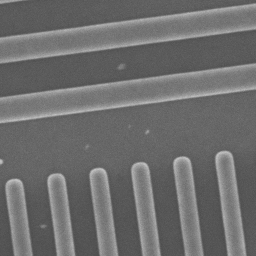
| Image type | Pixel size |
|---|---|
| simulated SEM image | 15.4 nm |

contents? groups of lines, slits or small figures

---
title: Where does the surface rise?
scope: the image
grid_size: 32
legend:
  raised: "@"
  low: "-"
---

--------------------------------
-------------------------@@@@@@@
-----------------@@@@@@@@@@@@@@@
----------@@@@@@@@@@@@@@@@@@@@@@
--@@@@@@@@@@@@@@@@@@@@@@@-------
@@@@@@@@@@@@@@@@@@--------------
@@@@@@@@@@----------------------
@@@-----------------------------
----------------------------@@@@
---------------------@@@@@@@@@@@
-------------@@@@@@@@@@@@@@@@@@@
-----@@@@@@@@@@@@@@@@@@@@@@@@---
@@@@@@@@@@@@@@@@@@@@@-----------
@@@@@@@@@@@@@@------------------
@@@@@@@-------------------------
--------------------------------
--------------------------------
--------------------------------
--------------------------------
---------------------------@@---
-----------------@----@@---@@---
------------@----@@---@@---@@---
------@@---@@----@@---@@---@@---
-@@---@@---@@@---@@---@@---@@@--
-@@---@@----@@---@@---@@----@@--
-@@---@@@---@@---@@---@@@---@@--
-@@----@@---@@---@@---@@@---@@--
-@@----@@---@@---@@----@@---@@--
-@@@---@@---@@---@@@---@@---@@--
-@@@---@@---@@----@@---@@---@@--
--@@---@@---@@----@@---@@---@@@-
--@@---@@---@@@---@@---@@---@@@-